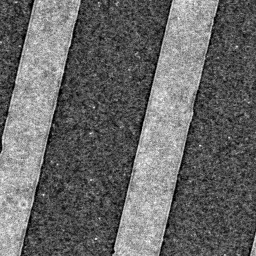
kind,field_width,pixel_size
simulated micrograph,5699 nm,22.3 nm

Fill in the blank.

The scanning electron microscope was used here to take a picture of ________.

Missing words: one or a few lines or trenches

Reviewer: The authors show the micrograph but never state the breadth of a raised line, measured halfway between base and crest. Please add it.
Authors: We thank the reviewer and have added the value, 972 nm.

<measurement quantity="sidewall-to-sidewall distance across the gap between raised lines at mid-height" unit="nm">2020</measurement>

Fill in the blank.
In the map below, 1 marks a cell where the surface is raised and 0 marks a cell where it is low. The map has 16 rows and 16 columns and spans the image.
0011100000011100
0011100000111000
0011000000111000
0111000000111000
0111000000111000
0111000000110000
0110000001110000
1110000001110000
1110000001110000
1110000001100000
1110000011100000
1100000011100000
1100000011100000
1100000011000000
1100000111000000
1000000111000000